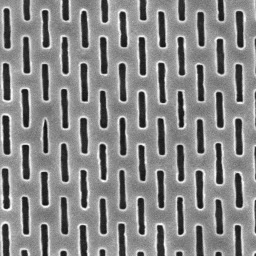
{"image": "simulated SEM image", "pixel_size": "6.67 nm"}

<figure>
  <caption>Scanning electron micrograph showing a regular array of holes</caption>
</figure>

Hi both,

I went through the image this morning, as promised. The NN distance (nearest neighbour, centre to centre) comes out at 0.216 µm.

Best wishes